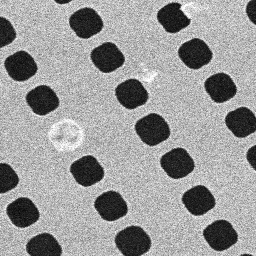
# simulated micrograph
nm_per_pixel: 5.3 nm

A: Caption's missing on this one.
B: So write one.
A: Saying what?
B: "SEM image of a regular array of holes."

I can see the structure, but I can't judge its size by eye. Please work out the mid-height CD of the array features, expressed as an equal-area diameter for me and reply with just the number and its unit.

164 nm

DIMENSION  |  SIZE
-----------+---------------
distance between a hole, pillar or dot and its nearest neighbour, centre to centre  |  219 nanometres